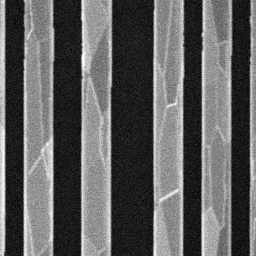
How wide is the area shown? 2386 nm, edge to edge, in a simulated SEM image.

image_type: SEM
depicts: lines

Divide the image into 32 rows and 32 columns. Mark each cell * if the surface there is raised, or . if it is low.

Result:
...***....****.....****..****..*
...***....****.....****..****..*
...***....****.....****..****..*
...****...****.....****..****..*
...****...****.....****..****..*
...****...****.....****..****..*
...****...****.....****..****..*
...****...****.....****..****..*
...***....****.....****..****..*
...***....****.....****..****..*
...***....****.....****..****..*
...***....****.....****..****..*
...***....****.....****..****..*
...***....****.....****..****..*
...***....****.....****..****..*
...***....****.....****..****..*
...***....****.....****..****..*
...***....****.....****..****..*
...***....****.....****..****..*
...***....****.....****..****..*
...***....****.....****..****..*
...***....****.....****..****..*
...***....****.....****..****..*
...***....****.....****..****..*
...***....****.....****..****..*
...***....****.....****..****..*
...***....****.....****..****..*
...***....****.....****..****..*
...***....****.....****..****..*
...***....****.....****..****..*
...***....****.....****..****..*
...***....****.....****..****..*